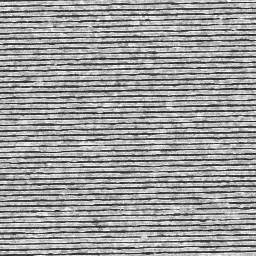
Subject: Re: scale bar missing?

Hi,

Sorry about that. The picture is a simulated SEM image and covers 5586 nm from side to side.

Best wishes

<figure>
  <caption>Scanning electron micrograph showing parallel lines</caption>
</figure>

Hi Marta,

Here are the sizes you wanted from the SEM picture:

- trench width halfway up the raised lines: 49.1 nm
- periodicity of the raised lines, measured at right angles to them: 0.118 micrometres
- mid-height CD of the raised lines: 65.4 nanometres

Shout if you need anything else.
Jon